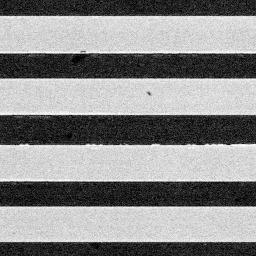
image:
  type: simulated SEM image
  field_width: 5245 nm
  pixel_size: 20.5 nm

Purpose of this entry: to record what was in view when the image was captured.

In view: lines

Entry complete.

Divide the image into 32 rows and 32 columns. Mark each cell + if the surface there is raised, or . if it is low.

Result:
................................
................................
++++++++++++++++++++++++++++++++
++++++++++++++++++++++++++++++++
++++++++++++++++++++++++++++++++
++++++++++++++++++++++++++++++++
++++++++++++++++++++++++++++++++
................................
................................
................................
++++++++++++++++++++++++++++++++
++++++++++++++++++++++++++++++++
++++++++++++++++++++++++++++++++
++++++++++++++++++++++++++++++++
................................
................................
................................
................................
++++++++++++++++++++++++++++++++
++++++++++++++++++++++++++++++++
++++++++++++++++++++++++++++++++
++++++++++++++++++++++++++++++++
++++++++++++++++++++++++++++++++
................................
................................
................................
++++++++++++++++++++++++++++++++
++++++++++++++++++++++++++++++++
++++++++++++++++++++++++++++++++
++++++++++++++++++++++++++++++++
................................
................................